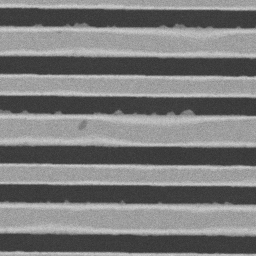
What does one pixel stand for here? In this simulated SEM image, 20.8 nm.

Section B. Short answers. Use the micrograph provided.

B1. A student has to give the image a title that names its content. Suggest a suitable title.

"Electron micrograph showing lines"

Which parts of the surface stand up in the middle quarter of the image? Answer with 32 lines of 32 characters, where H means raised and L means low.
LLLLLLLLLLLLLLLLLLLLLLLLLLLLLLLL
LLLLLLLLLLLLLLLLLLLLLLLLLLLLLLLL
LLLLLLLLLLLLLLLLLLLLLLLLLLLLLLLL
HHHHHHHHHHHHHHHHHHHHHHHHHHHHHHHH
HHHHHHHHHHHHHHHHHHHHHHHHHHHHHHHH
HHHHHHHHHHHHHHHHHHHHHHHHHHHHHHHH
HHHHHHHHHHHHHHHHHHHHHHHHHHHHHHHH
HHHHHHHHHHHHHHHHHHHHHHHHHHHHHHHH
LLLLLLLLLLLLLLLLLLLLLLLLLLLLLLLL
LLLLLLLLLLLLLLLLLLLLLLLLLLLLLLLL
LLLLLLLLLLLLLLLLLLLLLLLLLLLLLLLL
LLLLLLLLLLLLLLLLLLLLLLLLLLLLLLLL
LLLLLLLLLLLLLLLLLLLLLLLLLLLLLLLL
HHHHHHHHHHHHHHHHHHHHHHHHHHHHHHHH
HHHHHHHHHHHHHHHHHHHHHHHHHHHHHHHH
HHHHHHHHHHHHHHHHHHHHHHHHHHHHHHHH
HHHHHHHHHHHHHHHHHHHHHHHHHHHHHHHH
HHHHHHHHHHHHHHHHHHHHHHHHHHHHHHHH
HHHHHHHHHHHHHHHHHHHHHHHHHHHHHHHH
HHHHHHHHHHHHHHHHHHHHHHHHHHHHHHHH
LLLLLLLLLLLLLLLLLHLHHHHHHHHHHHHH
LLLLLLLLLLLLLLLLLLLLLLLLLLLLLLLL
LLLLLLLLLLLLLLLLLLLLLLLLLLLLLLLL
LLLLLLLLLLLLLLLLLLLLLLLLLLLLLLLL
LLLLLLLLLLLLLLLLLLLLLLLLLLLLLLLL
HHHHHHHHHHHHHHHHHHHHHHHHHHHHHHHH
HHHHHHHHHHHHHHHHHHHHHHHHHHHHHHHH
HHHHHHHHHHHHHHHHHHHHHHHHHHHHHHHH
HHHHHHHHHHHHHHHHHHHHHHHHHHHHHHHH
HHHHHHHHHHHHHHHHHHHHHHHHHHHHHHHH
LLLLLLLLLLLLLLLLLLLLLLLLLLLLLLLL
LLLLLLLLLLLLLLLLLLLLLLLLLLLLLLLL